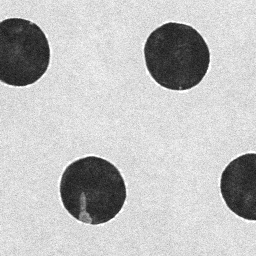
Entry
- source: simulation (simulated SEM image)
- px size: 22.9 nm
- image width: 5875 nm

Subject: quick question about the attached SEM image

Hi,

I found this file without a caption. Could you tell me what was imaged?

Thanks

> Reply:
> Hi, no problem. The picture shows holes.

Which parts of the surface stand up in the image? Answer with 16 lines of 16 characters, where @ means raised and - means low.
@@@@@@@@@@@@@@@@
--@@@@@@@@-@@@@@
---@@@@@@----@@@
---@@@@@@----@@@
---@@@@@@----@@@
@@@@@@@@@@--@@@@
@@@@@@@@@@@@@@@@
@@@@@@@@@@@@@@@@
@@@@@@@@@@@@@@@@
@@@@@@@@@@@@@@@@
@@@@---@@@@@@@--
@@@@----@@@@@@--
@@@@----@@@@@@--
@@@@@--@@@@@@@@-
@@@@@@@@@@@@@@@@
@@@@@@@@@@@@@@@@